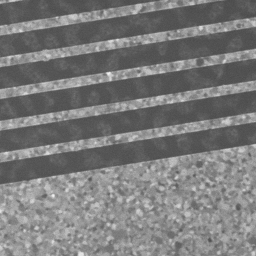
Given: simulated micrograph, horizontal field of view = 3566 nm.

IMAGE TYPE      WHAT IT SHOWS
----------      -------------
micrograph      parallel lines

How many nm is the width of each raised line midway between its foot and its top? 124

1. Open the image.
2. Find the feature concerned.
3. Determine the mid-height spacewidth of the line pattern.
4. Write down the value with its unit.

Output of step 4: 0.317 µm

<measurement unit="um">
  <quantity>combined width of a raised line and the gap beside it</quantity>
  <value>0.437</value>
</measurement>